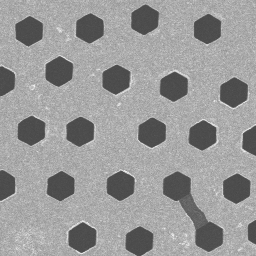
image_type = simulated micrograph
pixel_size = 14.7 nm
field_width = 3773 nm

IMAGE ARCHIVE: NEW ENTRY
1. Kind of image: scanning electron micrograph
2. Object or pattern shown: a regular array of holes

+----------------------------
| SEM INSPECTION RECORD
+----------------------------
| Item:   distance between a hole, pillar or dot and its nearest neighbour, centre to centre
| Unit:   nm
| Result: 779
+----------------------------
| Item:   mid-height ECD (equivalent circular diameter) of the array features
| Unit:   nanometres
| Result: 417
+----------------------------